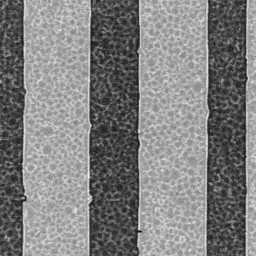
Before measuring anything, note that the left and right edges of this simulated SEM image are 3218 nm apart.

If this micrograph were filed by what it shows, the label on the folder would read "one or a few lines or trenches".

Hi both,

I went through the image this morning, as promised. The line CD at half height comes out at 828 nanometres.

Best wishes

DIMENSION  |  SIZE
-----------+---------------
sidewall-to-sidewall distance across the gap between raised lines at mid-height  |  561 nanometres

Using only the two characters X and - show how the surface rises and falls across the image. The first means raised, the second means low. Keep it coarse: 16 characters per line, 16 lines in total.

--XXXX---XXXX--X
--XXXX---XXXX--X
--XXXX---XXXX--X
--XXXX---XXXX--X
--XXXX---XXXX--X
--XXXX---XXXX--X
--XXXX---XXXX--X
--XXXX---XXXX--X
--XXXX---XXXX--X
-XXXXX---XXXX--X
-XXXXX---XXXX--X
--XXXX---XXXX--X
--XXXX---XXXX--X
-XXXXX---XXXX--X
--XXXX---XXXX--X
-XXXXX---XXXX--X